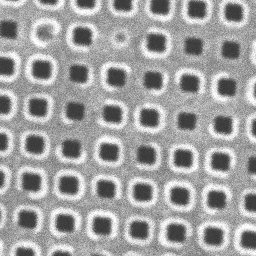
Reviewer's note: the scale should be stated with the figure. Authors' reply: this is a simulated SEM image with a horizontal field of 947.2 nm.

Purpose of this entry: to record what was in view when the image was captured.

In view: a regular array of holes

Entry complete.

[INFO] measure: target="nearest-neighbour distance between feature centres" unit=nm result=137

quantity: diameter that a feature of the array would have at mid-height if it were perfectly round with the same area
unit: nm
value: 69.6